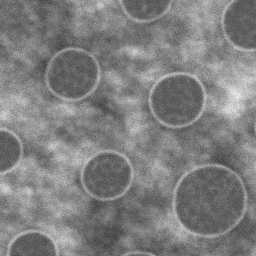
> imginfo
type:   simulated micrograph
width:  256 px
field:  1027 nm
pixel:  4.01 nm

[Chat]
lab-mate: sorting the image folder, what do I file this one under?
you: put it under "raised bodies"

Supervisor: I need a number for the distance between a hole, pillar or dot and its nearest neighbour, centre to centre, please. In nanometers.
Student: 420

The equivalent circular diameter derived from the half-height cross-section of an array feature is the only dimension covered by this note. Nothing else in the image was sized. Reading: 217 nm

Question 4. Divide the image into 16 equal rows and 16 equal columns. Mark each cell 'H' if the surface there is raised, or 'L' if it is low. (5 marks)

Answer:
LLLLLLLLHHHLLLHH
LLLLLLLLLLLLLLHH
LLLLLLLLLLLLLLHH
LLLHHHLLLLLLLLLL
LLLHHHLLLLLLLLLL
LLLHHHLLLLHHHLLL
LLLLLLLLLHHHHLLL
LLLLLLLLLLHHLLLL
HLLLLLLLLLLLLLLL
HLLLLLHLLLLLLLLL
HLLLLHHHLLLLHHLL
LLLLLHHHLLLHHHHL
LLLLLLLLLLLHHHHL
LLLLLLLLLLLHHHHL
LLLLLLLLLLLLHHLL
LHHHLLLLLLLLLLLL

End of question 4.